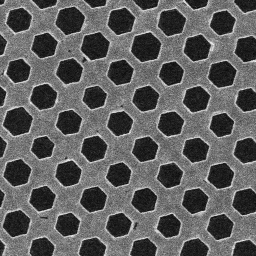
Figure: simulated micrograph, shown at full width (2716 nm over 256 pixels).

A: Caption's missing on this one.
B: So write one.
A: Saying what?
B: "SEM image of a regular array of holes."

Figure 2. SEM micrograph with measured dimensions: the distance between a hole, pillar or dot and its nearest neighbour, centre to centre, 380 nm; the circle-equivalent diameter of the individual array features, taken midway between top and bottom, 266 nanometres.